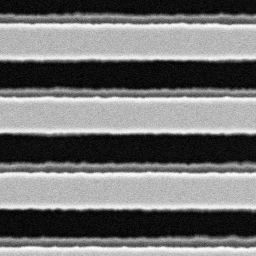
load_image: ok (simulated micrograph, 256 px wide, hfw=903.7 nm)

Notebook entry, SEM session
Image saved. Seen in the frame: lines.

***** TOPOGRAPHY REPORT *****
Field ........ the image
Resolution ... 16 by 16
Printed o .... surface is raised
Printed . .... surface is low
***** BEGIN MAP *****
................
oooooooooooooooo
oooooooooooooooo
oooooooooooooooo
................
................
oooooooooooooooo
oooooooooooooooo
................
................
oooooooooooooooo
oooooooooooooooo
oooooooooooooooo
................
................
oooooooooooooooo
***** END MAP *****